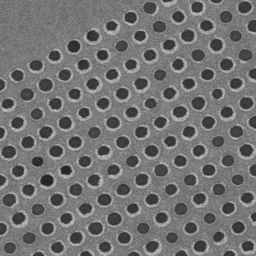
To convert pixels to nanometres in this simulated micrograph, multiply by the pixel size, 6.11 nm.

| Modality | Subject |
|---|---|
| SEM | a regular array of holes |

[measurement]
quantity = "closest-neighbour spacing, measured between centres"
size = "128 nm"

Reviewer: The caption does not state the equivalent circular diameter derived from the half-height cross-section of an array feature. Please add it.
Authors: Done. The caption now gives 74.9 nm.